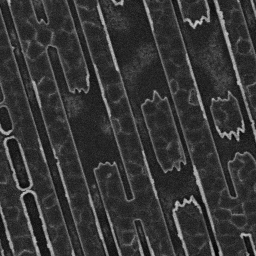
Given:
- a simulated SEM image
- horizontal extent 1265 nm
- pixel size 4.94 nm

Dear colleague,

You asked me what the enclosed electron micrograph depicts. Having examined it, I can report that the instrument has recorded parallel lines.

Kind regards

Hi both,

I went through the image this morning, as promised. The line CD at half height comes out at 0.114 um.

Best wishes